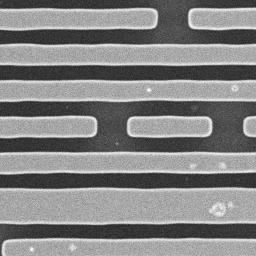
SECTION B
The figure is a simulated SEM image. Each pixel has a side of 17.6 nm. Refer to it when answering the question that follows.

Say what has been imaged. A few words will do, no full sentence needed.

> groups of lines, slits or small figures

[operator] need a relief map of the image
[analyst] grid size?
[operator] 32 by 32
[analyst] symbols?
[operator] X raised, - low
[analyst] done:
--------------------------------
XXXXXXXXXXXXXXXXXXXX----XXXXXXXX
XXXXXXXXXXXXXXXXXXXX----XXXXXXXX
XXXXXXXXXXXXXXXXXXX-----XXXXXXXX
--------------------------------
--------------------------------
XXXXXXXXXXXXXXXXXXXXXXXXXXXXXXXX
XXXXXXXXXXXXXXXXXXXXXXXXXXXXXXXX
--------------------------------
--------------------------------
XXXXXXXXXXXXXXXXXXXXXXXXXXXXXXXX
XXXXXXXXXXXXXXXXXXXXXXXXXXXXXXXX
XXXXXXXXXXXXXXXXXXXXXXXXXXXXXXXX
--------------------------------
--------------------------------
XXXXXXXXXXXX----XXXXXXXXXX-----X
XXXXXXXXXXXX----XXXXXXXXXX-----X
--------------------------------
--------------------------------
XXXXXXXXXXXXXXXXXXXXXXXXXXXXXXXX
XXXXXXXXXXXXXXXXXXXXXXXXXXXXXXXX
XXXXXXXXXXXXXXXXXXXXXXXXXXXXXXXX
--------------------------------
--------------------------------
XXXXXXXXXXXXXXXXXXXXXXXXXXXXXXXX
XXXXXXXXXXXXXXXXXXXXXXXXXXXXXXXX
XXXXXXXXXXXXXXXXXXXXXXXXXXXXXXXX
XXXXXXXXXXXXXXXXXXXXXXXXXXXXXXXX
--------------------------------
--------------------------------
XXXXXXXXXXXXXXXXXXXXXXXXXXXXXXXX
XXXXXXXXXXXXXXXXXXXXXXXXXXXXXXXX